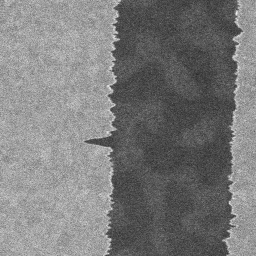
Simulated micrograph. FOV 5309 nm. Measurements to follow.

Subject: one or a few lines or trenches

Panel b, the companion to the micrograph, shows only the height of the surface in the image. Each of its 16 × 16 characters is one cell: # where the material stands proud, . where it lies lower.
#######........#
#######........#
#######........#
#######........#
#######........#
#######........#
#######........#
#######........#
#######........#
#######........#
#######........#
#######.......##
#######.......##
#######........#
#######.......##
#######.......##